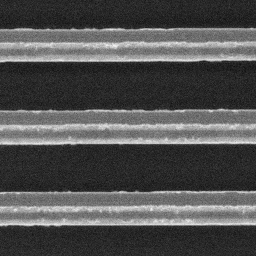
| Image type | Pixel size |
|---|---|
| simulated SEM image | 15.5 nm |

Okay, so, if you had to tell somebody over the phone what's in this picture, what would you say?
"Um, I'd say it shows lines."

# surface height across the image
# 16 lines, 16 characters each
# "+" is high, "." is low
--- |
................
................
++++++++++++++++
++++++++++++++++
................
................
................
++++++++++++++++
++++++++++++++++
................
................
................
++++++++++++++++
++++++++++++++++
................
................